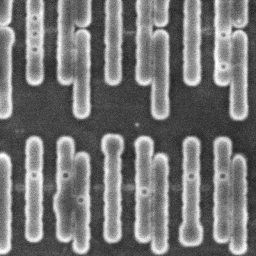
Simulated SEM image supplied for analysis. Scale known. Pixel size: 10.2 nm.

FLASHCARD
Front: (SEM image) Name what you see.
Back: wiring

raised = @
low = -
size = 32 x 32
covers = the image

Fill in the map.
@--@@--@@@@--@@--@@@@--@@--@@@@-
@--@@--@@@@--@@--@@@@--@@--@@@@-
@--@@--@@@@--@@--@@@@--@@--@@@@-
@--@@--@@-@--@@--@@----@@--@@---
@@-@@--@@@@--@@--@@@@--@@--@@@@-
@@-@@--@@@@--@@--@@@@--@@--@@@@-
@--@@--@@@@--@@--@@@@--@@--@@@@-
@--@@--@@@@--@@--@@@@--@@--@@@@-
@--@@--@@@@--@@--@@@@--@@--@@@@-
@--@@--@@@@--@@--@@@@--@@--@@@@-
@--------@@--------@@------@-@@-
@--------@@--------@@--------@@-
@--------@@--------@@--------@@-
@--------@@--------@@--------@@-
@---------@--------@@--------@@-
--------------------------------
--------------------------------
----@---@----@@--@@----@@--@@---
---@@--@@----@@--@@----@@--@@---
@--@@--@@@@--@@--@@----@@--@@---
@--@@--@@@@--@@--@@@@--@@--@@@@-
@--@@--@@@@--@@--@@@@--@@--@@@@-
@--@@--@@@@--@@--@@@@--@@--@@@@-
@--@@--@@@@--@@--@@@@--@@--@@@@-
@--@@--@@@@--@@--@@@@--@@--@@@@-
@--@@--@@@@--@@--@@@@--@@--@@@@-
@--@@--@@@@--@@--@@@@--@@--@@@@-
@--@@--@@@@--@@--@@@@--@@--@@@@-
@--@@--@@@@--@@--@@@@--@@--@@@@-
@--@@--@@@@--@@--@@@@--@@--@@@@-
@--------@@--------@@--@@----@@-
@----------------------------@--